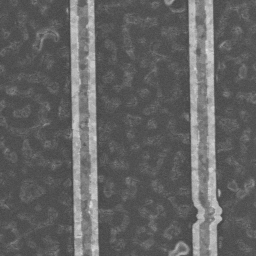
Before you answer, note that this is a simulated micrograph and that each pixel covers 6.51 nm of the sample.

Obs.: one or a few lines or trenches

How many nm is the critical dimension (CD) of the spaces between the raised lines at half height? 654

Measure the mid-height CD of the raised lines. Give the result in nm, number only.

116